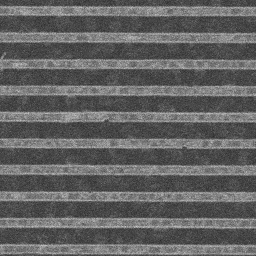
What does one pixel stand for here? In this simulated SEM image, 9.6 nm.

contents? parallel lines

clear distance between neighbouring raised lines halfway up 176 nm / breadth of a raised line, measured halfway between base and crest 0.0756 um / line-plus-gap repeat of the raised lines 0.254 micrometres